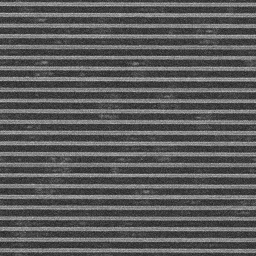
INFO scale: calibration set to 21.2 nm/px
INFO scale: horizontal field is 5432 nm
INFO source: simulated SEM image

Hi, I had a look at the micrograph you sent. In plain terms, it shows parallel lines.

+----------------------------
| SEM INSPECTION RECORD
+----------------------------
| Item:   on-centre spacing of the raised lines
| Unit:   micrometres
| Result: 0.227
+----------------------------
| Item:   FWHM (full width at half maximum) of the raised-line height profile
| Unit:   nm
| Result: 71.6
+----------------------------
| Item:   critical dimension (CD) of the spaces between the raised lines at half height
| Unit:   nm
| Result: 162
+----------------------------